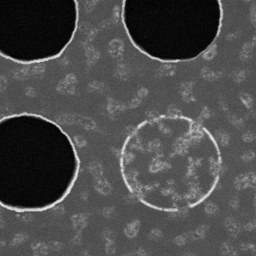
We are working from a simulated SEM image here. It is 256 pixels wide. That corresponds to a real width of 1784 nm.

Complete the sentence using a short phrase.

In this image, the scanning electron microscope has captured holes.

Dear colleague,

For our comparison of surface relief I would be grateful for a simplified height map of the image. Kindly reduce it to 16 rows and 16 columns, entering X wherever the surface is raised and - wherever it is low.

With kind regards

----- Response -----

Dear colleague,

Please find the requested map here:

-----XXX------XX
-----XXX------XX
----XXXX-----XXX
X--XXXXXXX--XXXX
XXXXXXXXXXXXXXXX
XXXXXXXXXXXXXXXX
XXXXXXXXXXXXXXXX
---XXXXXXXXXXXXX
----XXXXXXXXXXXX
-----XXXXXXXXXXX
-----XXXXXXXXXXX
----XXXXXXXXXXXX
----XXXXXXXXXXXX
XXXXXXXXXXXXXXXX
XXXXXXXXXXXXXXXX
XXXXXXXXXXXXXXXX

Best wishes